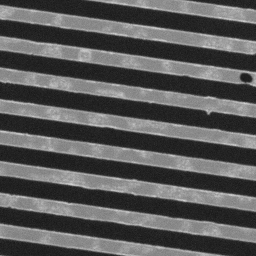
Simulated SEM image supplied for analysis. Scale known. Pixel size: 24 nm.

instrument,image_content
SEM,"parallel lines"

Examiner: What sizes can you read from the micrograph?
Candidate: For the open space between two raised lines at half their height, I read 430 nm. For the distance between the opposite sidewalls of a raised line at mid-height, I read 0.306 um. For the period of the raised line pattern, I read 743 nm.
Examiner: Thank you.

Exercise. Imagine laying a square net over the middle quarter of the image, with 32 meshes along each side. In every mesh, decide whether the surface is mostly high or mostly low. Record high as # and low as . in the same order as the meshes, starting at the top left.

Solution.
..............##################
.....................###########
............................####
.#..............................
########........................
################................
#######################.........
.......#######################..
..............##################
.......................#########
.............................###
##..............................
#########.......................
###############.................
..######################........
.........#####################..
................################
.......................#########
..............................##
####............................
###########.....................
##################..............
...#####################........
..........#####################.
.................###############
........................########
...............................#
#####...........................
############....................
###################.............
.....#####################......
..........######################